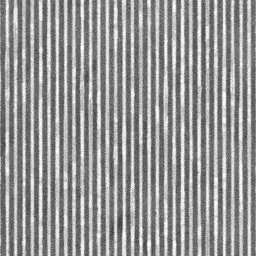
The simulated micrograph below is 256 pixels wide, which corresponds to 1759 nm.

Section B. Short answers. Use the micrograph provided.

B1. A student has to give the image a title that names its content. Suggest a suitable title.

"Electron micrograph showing parallel lines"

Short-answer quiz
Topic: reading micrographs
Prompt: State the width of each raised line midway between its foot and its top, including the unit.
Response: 18 nm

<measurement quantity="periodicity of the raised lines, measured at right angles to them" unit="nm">57.3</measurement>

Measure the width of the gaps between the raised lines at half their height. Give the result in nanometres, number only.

42.1